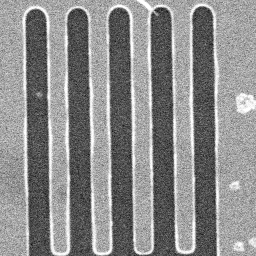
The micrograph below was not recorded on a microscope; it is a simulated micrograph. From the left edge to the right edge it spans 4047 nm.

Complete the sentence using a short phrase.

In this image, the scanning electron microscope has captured groups of lines, slits or small figures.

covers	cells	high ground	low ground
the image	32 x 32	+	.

++++++++++++++++++++++++++++++++
+++...+++..+++..+++..+++...+++++
+++...++...++...+++...++...+++++
+++...++...++...+++...++...+++++
+++...++...++...+++...++...+++++
+++...++...++...+++...++...+++++
+++...++...++....++...++...+++++
+++...++...++....++...++...+++++
+++...++...++....++...++...+++++
+++...++...+++...++...++...+++++
+++...++...+++...++...++...+++++
+++...++...++....++...++...+++++
+++...++...++....++...++...+++++
+++...++...++....++...++...+++++
+++...++...++....++...++...+++++
+++...++...+++...++...++...+++++
+++...++....++...++...++...+++++
+++...++....++...++...++...+++++
+++...++....++...++...++...+++++
+++...++...+++...++...++...+++++
+++...+++..+++...++...++...+++++
+++...+++..+++...++...++...+++++
+++...+++...++...++...++...+++++
+++...+++...++...++...++...+++++
+++...++....++...++...++...+++++
+++...++....++...++...++...+++++
+++...++....++...++...++...+++++
+++...++....++...++...++...+++++
+++...++....++...++...++...+++++
+++...+++...++...++...++...+++++
+++...+++...++...++...++...+++++
+++....+....++...++........+++++